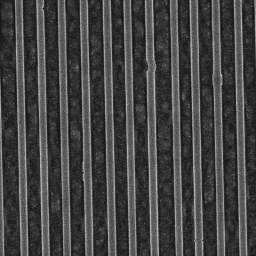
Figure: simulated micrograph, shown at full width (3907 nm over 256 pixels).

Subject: parallel lines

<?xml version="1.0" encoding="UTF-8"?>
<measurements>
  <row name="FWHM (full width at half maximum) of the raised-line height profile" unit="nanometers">103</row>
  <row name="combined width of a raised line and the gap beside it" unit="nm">334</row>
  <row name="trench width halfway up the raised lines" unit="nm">217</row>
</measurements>